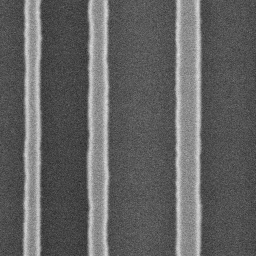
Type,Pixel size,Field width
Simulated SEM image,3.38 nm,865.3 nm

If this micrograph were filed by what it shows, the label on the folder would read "lines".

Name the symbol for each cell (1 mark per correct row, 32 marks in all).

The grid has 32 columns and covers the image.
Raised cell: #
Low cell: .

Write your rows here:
...##......##.........###.......
...##......##.........###.......
...##......##.........###.......
...##......##.........###.......
...##......##.........###.......
...##......##.........###.......
...##......##.........###.......
...##......##.........###.......
...##......##.........###.......
...##......##.........###.......
...##......##.........###.......
...##......##.........###.......
...##......##.........###.......
...##......##.........###.......
...##......##.........###.......
...##......##.........###.......
...##......##.........###.......
...##......##.........###.......
...##......##.........###.......
...##......##.........###.......
...##......##.........###.......
...##......##.........###.......
...##......##.........###.......
...##......##.........###.......
...##......##.........###.......
...##......##.........###.......
...##......##.........###.......
...##......##.........###.......
...##......##.........###.......
...##......##.........###.......
...##......##.........###.......
...##......##.........###.......